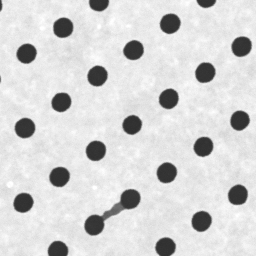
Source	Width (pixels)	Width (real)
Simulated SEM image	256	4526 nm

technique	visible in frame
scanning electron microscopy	a regular array of holes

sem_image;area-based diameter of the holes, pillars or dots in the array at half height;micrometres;0.369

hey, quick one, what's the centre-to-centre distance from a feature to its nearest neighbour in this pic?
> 790 nm